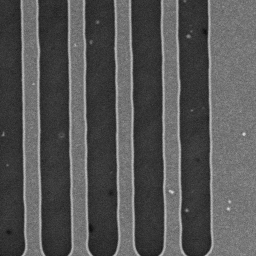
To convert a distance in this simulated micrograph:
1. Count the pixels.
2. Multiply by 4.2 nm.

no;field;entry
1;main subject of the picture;groups of lines, slits or small figures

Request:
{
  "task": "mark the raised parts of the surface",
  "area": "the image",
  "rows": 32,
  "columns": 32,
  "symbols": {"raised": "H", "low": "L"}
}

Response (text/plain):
LLLHHLLLLHLLLLHHLLLLHHLLLLHHHHHH
LLLHHLLLLHLLLLHHLLLLHHLLLLHHHHHH
LLLHHLLLLHHLLLLHLLLLHHLLLLHHHHHH
LLLHHLLLLHHLLLLHLLLLHHLLLLHHHHHH
LLLHHLLLLHHLLLLHLLLLHHLLLLHHHHHH
LLLHHLLLLHHLLLLHLLLLHHLLLLHHHHHH
LLLHHLLLLHHLLLLHLLLLHHLLLLHHHHHH
LLLHHLLLLHHLLLLHLLLLHHLLLLHHHHHH
LLLHHLLLLHHLLLLHLLLLHHLLLLHHHHHH
LLLHHLLLLHHLLLLHLLLLHHLLLLHHHHHH
LLLHHLLLLHHLLLLHLLLLHHLLLLHHHHHH
LLLHHLLLLHHLLLLHLLLLHHLLLLHHHHHH
LLLHHLLLLHHLLLLHHLLLHHLLLLHHHHHH
LLLHHLLLLHHLLLLHHLLLHHLLLLHHHHHH
LLLHHLLLLHHLLLLHHLLLHHLLLLHHHHHH
LLLHHLLLLHHLLLLHHLLLHHLLLLHHHHHH
LLLHHLLLLHHLLLLHHLLLHHLLLLHHHHHH
LLLHHLLLLHHLLLLHHLLLHHLLLLHHHHHH
LLLHHLLLLHHLLLLHHLLLHHHLLLHHHHHH
LLLHHLLLLHHLLLLHHLLLHHHLLLHHHHHH
LLLHHLLLLHHLLLLHHLLLLHHLLLHHHHHH
LLLHHLLLLHHLLLLHHLLLLHHLLLHHHHHH
LLLHHLLLLHHLLLLHHLLLLHHLLLHHHHHH
LLLHHLLLLHHLLLLHHLLLHHHLLLHHHHHH
LLLHHLLLLHHLLLLHHLLLHHHLLLHHHHHH
LLLHHLLLLHHLLLLHHLLLLHHLLLHHHHHH
LLLHHLLLLHHLLLLHHLLLLHHLLLHHHHHH
LLLHHLLLLHHLLLLHHLLLLHHLLLHHHHHH
LLLHHLLLLHHLLLLHHLLLLHHLLLHHHHHH
LLLHHLLLLHHLLLLHHLLLLHHLLLHHHHHH
LLLHHLLLLHHLLLLHHLLLLHHLLLHHHHHH
LLLHHLLLLHHLLLLHHLLLHHHLLLHHHHHH